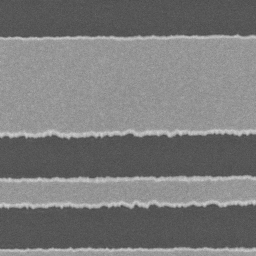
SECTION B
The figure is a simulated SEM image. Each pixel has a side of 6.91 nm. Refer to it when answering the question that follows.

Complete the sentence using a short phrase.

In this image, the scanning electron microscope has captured lines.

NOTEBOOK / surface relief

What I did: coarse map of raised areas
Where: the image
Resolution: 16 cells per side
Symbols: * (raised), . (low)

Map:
................
................
****************
****************
****************
****************
****************
****************
*******...*.....
................
................
****************
****************
................
................
...........*....